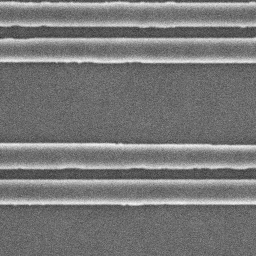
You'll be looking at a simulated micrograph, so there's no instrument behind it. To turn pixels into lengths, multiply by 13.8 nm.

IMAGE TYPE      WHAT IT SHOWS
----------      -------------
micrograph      lines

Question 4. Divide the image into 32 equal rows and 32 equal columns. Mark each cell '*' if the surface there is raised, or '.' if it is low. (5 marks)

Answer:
********************************
********************************
********************************
................................
................................
********************************
********************************
********************************
................................
................................
................................
................................
................................
................................
................................
................................
................................
................................
********************************
********************************
********************************
................................
................................
********************************
********************************
.*.*.*.........***..............
................................
................................
................................
................................
................................
................................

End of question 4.